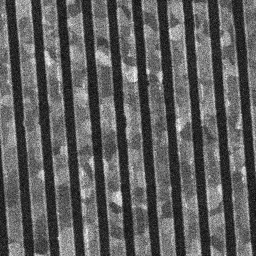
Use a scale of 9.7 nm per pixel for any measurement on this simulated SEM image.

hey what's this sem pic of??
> parallel lines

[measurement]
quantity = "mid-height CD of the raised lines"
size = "139 nanometers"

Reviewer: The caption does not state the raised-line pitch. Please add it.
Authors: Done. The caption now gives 244 nm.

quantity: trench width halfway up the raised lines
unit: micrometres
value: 0.106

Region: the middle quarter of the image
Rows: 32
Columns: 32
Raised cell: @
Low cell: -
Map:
--@@@---@@@@---@@@---@@@---@@@@-
--@@@---@@@@---@@@---@@@---@@@@-
--@@@@--@@@@---@@@---@@@---@@@@-
--@@@@---@@@---@@@---@@@----@@@-
--@@@@---@@@---@@@----@@----@@@-
--@@@@---@@@---@@@---@@@@--@@@@-
--@@@@---@@@---@@@---@@@@---@@@-
---@@@---@@@---@@@---@@@@---@@@-
---@@@---@@@---@@@---@@@@---@@@-
---@@@---@@@---@@@@--@@@@---@@@-
---@@@---@@@---@@@@---@@@---@@@-
---@@@---@@@@--@@@@---@@@---@@@-
---@@@---@@@@--@@@@---@@@---@@@-
---@@@---@@@@---@@@---@@@---@@@-
---@@@---@@@@---@@@---@@@---@@@@
---@@@@--@@@@---@@@---@@@@--@@@@
---@@@@---@@@---@@@---@@@@--@@@@
---@@@@---@@@---@@@---@@@@--@@@@
---@@@@---@@@---@@@---@@@@--@@@@
---@@@@---@@@---@@@---@@@@---@@@
@--@@@@---@@@---@@@---@@@@---@@@
@---@@@---@@@---@@@----@@@---@@@
@---@@@---@@@---@@@@---@@@---@@@
@---@@@---@@@---@@@@---@@@---@@@
@---@@@---@@@@--@@@@---@@@---@@@
@---@@@---@@@@---@@@---@@@---@@@
@---@@@---@@@@---@@@---@@@---@@@
@---@@@---@@@@---@@@---@@@---@@@
@---@@@---@@@@---@@@---@@@---@@@
@---@@@@---@@@---@@@---@@@----@@
@---@@@@---@@@---@@@---@@@----@@
@---@@@@---@@@---@@@---@@@@---@@